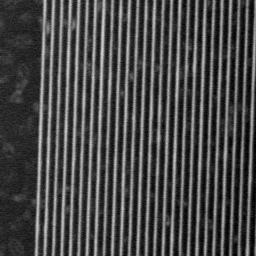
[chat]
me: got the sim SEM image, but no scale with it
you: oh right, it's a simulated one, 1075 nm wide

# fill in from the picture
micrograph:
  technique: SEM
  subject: parallel lines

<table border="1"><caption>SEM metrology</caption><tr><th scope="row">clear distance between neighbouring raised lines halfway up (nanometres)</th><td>27.3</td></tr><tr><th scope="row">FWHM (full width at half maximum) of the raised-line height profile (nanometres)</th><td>7.9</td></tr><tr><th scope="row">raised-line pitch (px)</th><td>8.43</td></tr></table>